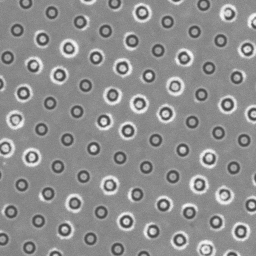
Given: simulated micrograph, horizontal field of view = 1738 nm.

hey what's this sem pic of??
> a regular array of ring-shaped grooves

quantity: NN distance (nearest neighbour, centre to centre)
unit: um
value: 0.187